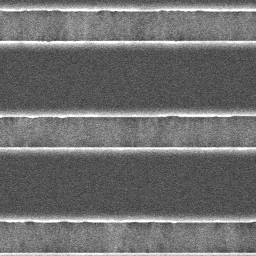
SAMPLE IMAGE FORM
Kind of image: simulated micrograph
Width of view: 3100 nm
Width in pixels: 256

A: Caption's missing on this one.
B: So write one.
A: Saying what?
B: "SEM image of lines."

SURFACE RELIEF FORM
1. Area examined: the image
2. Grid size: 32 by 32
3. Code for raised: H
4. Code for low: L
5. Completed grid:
HHHHHHHHHHHHHHHHHHHHHHHHHHHHHHHH
LLLLLLLLLLLLLLLLLLLLLLLLLLLLLLLL
LLLLLLLLLLLLLLLLLLLLLLLLLLLLLLLL
LLLLLLLLLLLLLLLLLLLLLLLLLLLLLLLL
LLLLLLLLLLLLLLLLLLLLLLLLLLLLLLLL
HHHHHHHHHHHHHHHHHHHHHHHHHHHHHHHH
HHHHHHHHHHHHHHHHHHHHHHHHHHHHHHHH
HHHHHHHHHHHHHHHHHHHHHHHHHHHHHHHH
HHHHHHHHHHHHHHHHHHHHHHHHHHHHHHHH
HHHHHHHHHHHHHHHHHHHHHHHHHHHHHHHH
HHHHHHHHHHHHHHHHHHHHHHHHHHHHHHHH
HHHHHHHHHHHHHHHHHHHHHHHHHHHHHHHH
HHHHHHHHHHHHHHHHHHHHHHHHHHHHHHHH
HHHHHHHHHHHHHHHHHHHHHHHHHHHHHHHH
HHHHHHHHHHHHHHHHHHHHHLHHHHHHHLLL
LLLLLLLLLLLLLLLLLLLLLLLLLLLLLLLL
LLLLLLLLLLLLLLLLLLLLLLLLLLLLLLLL
LLLLLLLLLLLLLLLLLLLLLLLLLLLLLLLL
LLLLLLLLLLLLLLLLLLLLLLLLLLLLLLLL
HHHHHHHHHHHHHHHHHHHHHHHHHHHHHHHH
HHHHHHHHHHHHHHHHHHHHHHHHHHHHHHHH
HHHHHHHHHHHHHHHHHHHHHHHHHHHHHHHH
HHHHHHHHHHHHHHHHHHHHHHHHHHHHHHHH
HHHHHHHHHHHHHHHHHHHHHHHHHHHHHHHH
HHHHHHHHHHHHHHHHHHHHHHHHHHHHHHHH
HHHHHHHHHHHHHHHHHHHHHHHHHHHHHHHH
HHHHHHHHHHHHHHHHHHHHHHHHHHHHHHHH
HHHHHHHHHHHHHHHHHHHHHHHHHHHHHHHH
LLLLLLLLLLLLLLLLLLLLLLLLLLLLLLLL
LLLLLLLLLLLLLLLLLLLLLLLLLLLLLLLL
LLLLLLLLLLLLLLLLLLLLLLLLLLLLLLLL
LLLLLLLLLLLLLLLLLLLLLLLLLLLLLLLL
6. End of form